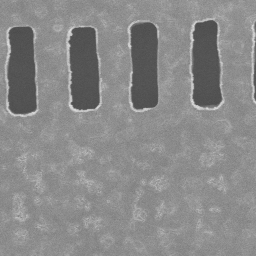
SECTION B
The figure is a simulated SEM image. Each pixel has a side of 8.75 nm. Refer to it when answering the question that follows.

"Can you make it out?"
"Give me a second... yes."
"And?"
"holes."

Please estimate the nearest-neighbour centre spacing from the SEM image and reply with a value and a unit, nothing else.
533 nanometres